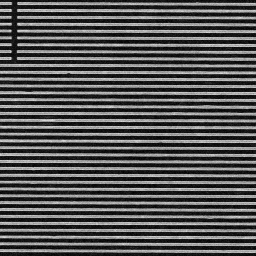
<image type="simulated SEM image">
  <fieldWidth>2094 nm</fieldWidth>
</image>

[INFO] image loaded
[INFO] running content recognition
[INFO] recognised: parallel lines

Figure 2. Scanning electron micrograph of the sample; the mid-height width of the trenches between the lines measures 36.8 nm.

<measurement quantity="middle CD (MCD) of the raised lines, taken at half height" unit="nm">18.4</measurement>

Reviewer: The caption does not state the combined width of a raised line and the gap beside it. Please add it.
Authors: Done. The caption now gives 56.2 nm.